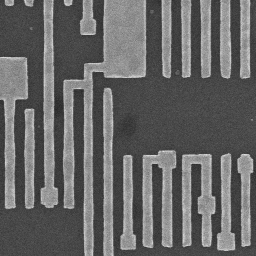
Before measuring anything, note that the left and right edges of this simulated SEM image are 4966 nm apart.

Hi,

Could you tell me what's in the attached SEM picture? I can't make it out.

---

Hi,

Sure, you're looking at wiring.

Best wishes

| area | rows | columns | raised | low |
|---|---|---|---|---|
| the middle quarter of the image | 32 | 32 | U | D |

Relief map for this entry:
DDDDDUUUUUUUUUUUUUUUDDDDDUUDDDUD
DDDDDUUUUUUUUUUUUUUUDDDDDUUDDDUD
DDDDDUUDDDUUUUUUUUUUDDDDDUUDDDUD
DDDDDUUDDDDDDDDDDDDDDDDDDDDDDDDD
UUUUUUUDDDDDDDDDDDDDDDDDDDDDDDDD
UUUUUUUDDDDDDDDDDDDDDDDDDDDDDDDD
UUDDDUUDDDUUDDDDDDDDDDDDDDDDDDDD
UUDDDUUDDDUUDDDDDDDDDDDDDDDDDDDD
UUDDDUUDDDUUDDDDDDDDDDDDDDDDDDDD
UUDDDUUDDDUUDDDDDDDDDDDDDDDDDDDD
UUDDDUUDDDUUDDDDDDDDDDDDDDDDDDDD
UUDDDUUDDDUUDDDDDDDDDDDDDDDDDDDD
UUDDDUUDDDUUDDDDDDDDDDDDDDDDDDDD
UUDDDUUDDDUUDDDDDDDDDDDDDDDDDDDD
UUDDDUUDDDUUDDDDDDDDDDDDDDDDDDDD
UUDDDUUDDDUUDDDDDDDDDDDDDDDDDDDD
UUDDDUUDDDUUDDDDDDDDDDDDDDDDDDDD
UUDDDUUDDDUUDDDDDDDDDDDDDDDDDDDD
UUDDDUUDDDUUDDDDDDDDDDDDDDDDDDDD
UUDDDUUDDDUUDDDDDDDDDDDDDDDDDDDD
UUDDDUUDDDUUDDDDDDDDDDDDDDDDDDDD
UUDDDUUDDDUUDDDDDDDDDDDDDDDDDDDD
UUDDDUUDDDUUDDDDDDDDDDDDUUUUDDDD
UUDDDUUDDDUUDDDUUDDDUUUUUUUUDDUU
UUDDDUUDDDUUDDDUUDDDUUUUUUUUDDUU
UUDDDUUDDDUUDDDUUDDDUUDDUUUUDDUU
UUDDDUUDDDUUDDDUUDDDUUDDDUUDDDUU
UUDDDUUDDDUUDDDUUDDDUUDDDUUDDDUU
UUDDDUUDDDUUDDDUUDDDUUDDDUUDDDUU
UUDDDUUDDDUUDDDUUDDDUUDDDUUDDDUU
UUDDDUUDDDUUDDDUUDDDUUDDDUUDDDUU
UUDDDUUDDDUUDDDUUDDDUUDDDUUDDDUU